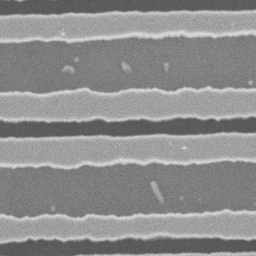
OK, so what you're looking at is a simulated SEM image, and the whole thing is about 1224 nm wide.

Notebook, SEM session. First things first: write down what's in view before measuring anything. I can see lines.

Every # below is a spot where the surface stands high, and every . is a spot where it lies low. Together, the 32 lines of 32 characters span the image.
................................
.............###################
################################
################################
#####################..#..##....
................................
................................
................................
................................
................................
................................
.###...#####...#################
################################
################################
################################
................................
................................
################################
################################
################################
##############...##.####........
................................
................................
................................
................................
................................
...........................#####
################################
################################
################################
................................
................................